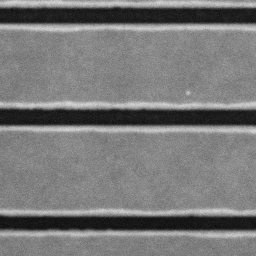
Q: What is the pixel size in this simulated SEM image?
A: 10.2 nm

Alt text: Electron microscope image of lines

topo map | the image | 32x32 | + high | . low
++++++++++++++++++++++++++++++++
................................
................................
++++++++++++++++++++++++++++++++
++++++++++++++++++++++++++++++++
++++++++++++++++++++++++++++++++
++++++++++++++++++++++++++++++++
++++++++++++++++++++++++++++++++
++++++++++++++++++++++++++++++++
++++++++++++++++++++++++++++++++
++++++++++++++++++++++++++++++++
++++++++++++++++++++++++++++++++
++++++++++++++++++++++++++++++++
................................
................................
................................
++++++++++++++++++++++++++++++++
++++++++++++++++++++++++++++++++
++++++++++++++++++++++++++++++++
++++++++++++++++++++++++++++++++
++++++++++++++++++++++++++++++++
++++++++++++++++++++++++++++++++
++++++++++++++++++++++++++++++++
++++++++++++++++++++++++++++++++
++++++++++++++++++++++++++++++++
++++++++++++++++++++++++++++++++
++++++++++++++++++++++++++++++++
................................
................................
++++++++++++++++++++++++++++++++
++++++++++++++++++++++++++++++++
++++++++++++++++++++++++++++++++